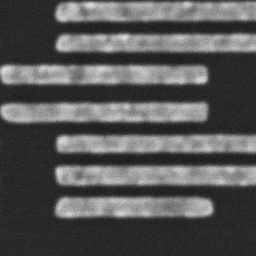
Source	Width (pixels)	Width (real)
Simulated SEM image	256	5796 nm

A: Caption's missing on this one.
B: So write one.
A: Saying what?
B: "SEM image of wiring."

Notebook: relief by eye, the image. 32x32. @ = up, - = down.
--------@@@@@@@@@@@@@@@@@@@@@@@@
-------@@@@@@@@@@@@@@@@@@@@@@@@@
--------@@----------------------
--------------------------------
--------@@-@@@@@@@@@@@@@@@@@@@@@
-------@@@@@@@@@@@@@@@@@@@@@@@@@
--------------------------------
--------------------------------
@@@@@@@@@@@@@@@@@@@@@@@@@-------
@@@@@@@@@@@@@@@@@@@@@@@@@@------
--------------------------------
--------------------------------
--------------------------------
@@@@@@@@@@@@@@@@@@@@@@@@@@------
@@@@@@@@@@@@@@@@@@@@@@@@@@------
--------------------------------
--------------------------------
-------@@@@@@@@@@@@@@@@@@@@@@@@@
-------@@@@@@@@@@@@@@@@@@@@@@@@@
--------------------------------
--------------------------------
-------@@@@@@@@@@@@@@@@@@@@@@@@@
-------@@@@@@@@@@@@@@@@@@@@@@@@@
--------------------------------
--------------------------------
-------@@@@@@@@@@@@@@@@@@@------
-------@@@@@@@@@@@@@@@@@@@------
--------------------------------
--------------------------------
--------------------------------
--------------------------------
--------------------------------